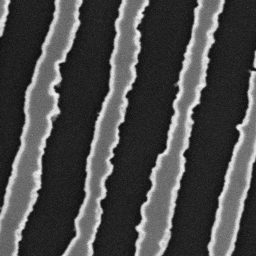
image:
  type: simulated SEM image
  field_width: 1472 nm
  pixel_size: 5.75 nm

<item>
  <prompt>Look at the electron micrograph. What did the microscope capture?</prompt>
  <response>one or a few lines or trenches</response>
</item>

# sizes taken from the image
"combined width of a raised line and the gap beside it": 399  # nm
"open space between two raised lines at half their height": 277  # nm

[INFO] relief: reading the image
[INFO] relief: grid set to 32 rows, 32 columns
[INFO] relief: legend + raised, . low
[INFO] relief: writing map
+......+++.....+++.......+++....
+......+++.....+++.......++.....
.......+++.....++.......+++.....
......+++......++.......+++.....
......+++......++.......++......
......+++.....+++.......++......
.....+++......+++......+++......
.....+++......+++......+++......
.....++.......+++......+++......
....+++.......+++......+++.....+
....+++.......++.......++......+
....+++.......++.......++......+
...++++......+++......+++......+
...++++......++.......++.......+
...+++.......++.......++.......+
...+++......+++.......++......++
...+++......+++......+++......++
...+++......+++......++.......++
...++.......++.......++.......++
..+++......+++......+++......+++
..+++......+++......+++......++.
..+++......+++.....++++......++.
.++++......++......+++......+++.
.++++......++......+++......+++.
.+++.......++......+++......+++.
.+++.......++.....++++.....+++..
++++......+++.....+++......+++..
+++.......+++.....+++......+++..
+++.......++.....++++......+++..
++........++......+++......++...
++.......++......+++......+++...
++......+++......+++......+++...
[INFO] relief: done